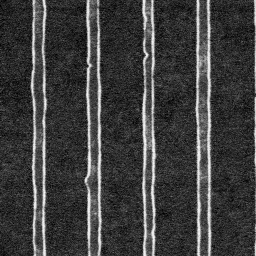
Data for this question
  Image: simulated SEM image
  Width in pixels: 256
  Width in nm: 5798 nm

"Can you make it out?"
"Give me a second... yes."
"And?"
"parallel lines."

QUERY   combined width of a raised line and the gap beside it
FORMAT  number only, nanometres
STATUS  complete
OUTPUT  1240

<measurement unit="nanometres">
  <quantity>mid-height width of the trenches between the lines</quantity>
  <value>1020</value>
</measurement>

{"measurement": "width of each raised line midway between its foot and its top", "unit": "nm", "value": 229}